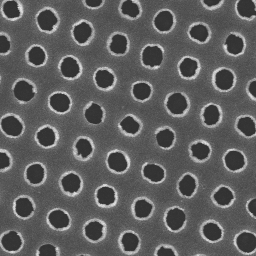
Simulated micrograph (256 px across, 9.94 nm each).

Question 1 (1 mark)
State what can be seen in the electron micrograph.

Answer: a regular array of holes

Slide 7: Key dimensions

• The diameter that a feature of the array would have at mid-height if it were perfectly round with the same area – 182 nanometres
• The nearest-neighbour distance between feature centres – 360 nm